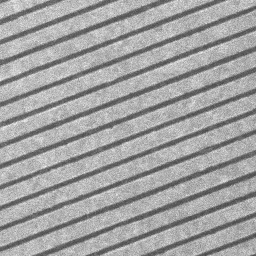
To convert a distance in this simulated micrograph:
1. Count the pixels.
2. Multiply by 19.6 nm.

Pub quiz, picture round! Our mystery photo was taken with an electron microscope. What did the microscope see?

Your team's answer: parallel lines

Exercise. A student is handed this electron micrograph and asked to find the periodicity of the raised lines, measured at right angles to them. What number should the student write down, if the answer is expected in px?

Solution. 19.3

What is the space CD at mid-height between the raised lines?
0.121 microns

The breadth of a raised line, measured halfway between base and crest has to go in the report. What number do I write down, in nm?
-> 258